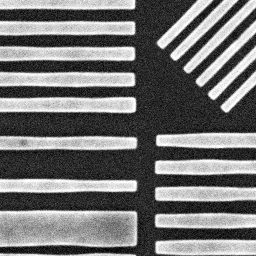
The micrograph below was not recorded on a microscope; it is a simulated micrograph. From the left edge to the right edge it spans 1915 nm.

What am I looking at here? groups of lines, slits or small figures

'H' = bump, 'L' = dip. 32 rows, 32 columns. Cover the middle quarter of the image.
LLLLLLLLLLLLLLLLLLLLLLLLLLLLLLHH
LLLLLLLLLLLLLLLLLLLLLLLLLLLLLLHH
HHHHHHHHLLHHHHHHHLLLLLLLLLLLLLLL
HHHHHHHHHHHHHHHHHLLLLLLLLLLLLLLL
HHHHHHHHHHHHHHHHHLLLLLLLLLLLLLLL
HHHHHLLLLLLLLLLLLLLLLLLLLLLLLLLL
LLLLLLLLLLLLLLLLLLLLLLLLLLLLLLLL
LLLLLLLLLLLLLLLLLLLLLLLLLLLLLLLL
LLLLLLLLLLLLLLLLLLLLLLLLLLLLLLLL
HHHHHHHHHHHHHHHHHHLLLLLLLLLLLLLL
HHHHHHHHHHHHHHHHHHLLLLLLLLLLLLLL
HHHHHHHHHHHHHHHHHHLLLLLLLLLLLLLL
LLLLLLLLLLLLLLLLLLLLLLLLLLLLLLLL
LLLLLLLLLLLLLLLLLLLLLLLLLLLLLLLL
LLLLLLLLLLLLLLLLLLLLLLLLLLLLLLLL
LLLLLLLLLLLLLLLLLLLLLLLLLLLLLLLL
LLLLLLLLLLLLLLLLLLLLLLLLLLLLLLLL
LLLLLLLLLLLLLLLLLLLLLLLLLLLLLLLL
LHHHHHHHHHHHLLLLLLLLLLLHHHHHHHHH
HHHHHHHHHHHHHHHHHHLLLLLHHHHHHHHH
HHHHHHHHHHHHHHHHHHLLLLLLLLLLHHHH
LLLLLLLLLLLLLLLLLLLLLLLLLLLLLLLL
LLLLLLLLLLLLLLLLLLLLLLLLLLLLLLLL
LLLLLLLLLLLLLLLLLLLLLLLLLLLLLLLL
LLLLLLLLLLLLLLLLLLLLLLLHHHHHHHHH
LLLLLLLLLLLLLLLLLLLLLLLHHHHHHHHH
LLLLLLLLLLLLLLLLLLLLLLLHHHHHHHHH
LLLLLLLLLLLLLLLLLLLLLLLLLLLLLLLL
LLLLLLLLLLLLLLLLLLLLLLLLLLLLLLLL
HHHHHHHHHHHHHHHHHHLLLLLLLLLLLLLL
HHHHHHHHHHHHHHHHHHLLLLLLLLLLLLLL
HHHHHHHHHHHHHHHHHHLLLLLHHHHHHHHH